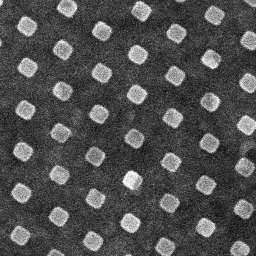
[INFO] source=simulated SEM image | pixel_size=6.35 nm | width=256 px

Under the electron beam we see a regular array of raised bodies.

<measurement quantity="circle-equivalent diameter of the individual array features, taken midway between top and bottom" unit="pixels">17.5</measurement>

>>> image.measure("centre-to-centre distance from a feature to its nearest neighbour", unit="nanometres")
262